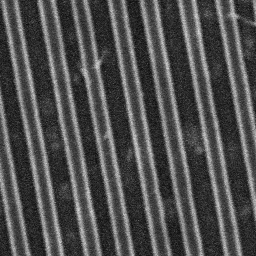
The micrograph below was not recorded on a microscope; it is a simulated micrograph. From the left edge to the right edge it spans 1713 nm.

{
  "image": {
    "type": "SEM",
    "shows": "parallel lines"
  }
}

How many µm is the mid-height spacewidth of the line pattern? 0.153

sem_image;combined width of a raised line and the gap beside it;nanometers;234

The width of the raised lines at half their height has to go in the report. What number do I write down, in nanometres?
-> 88.8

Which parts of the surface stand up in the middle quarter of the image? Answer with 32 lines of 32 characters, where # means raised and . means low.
.....####.....####....####......
#....####......###.....###......
#....####......###.....###......
#....####......###.....###......
#.....###......###.....###......
#.....###......####....####.....
#.....####.....####....####.....
#.....####......###.....###.....
##....####......###.....###.....
##.....###......###.....###.....
##.....###......###.....####....
##.....###......####....####....
###....####.....####.....###....
###....####......###.....###....
###.....###......###.....###....
###.....###......###.....###....
###.....###......####....####...
###.....####.....####....####...
####....####......###.....###...
####.....###......###.....###...
.###.....###......###.....###...
.###.....###......###.....####..
.###.....###......####....####..
.####....####.....####....####..
..###.....###......###.....###..
..###.....###......###.....####.
..###.....###......###.....####.
..###.....###......####....####.
..###.....####......###....####.
..####....####......###.....###.
...###.....###......###.....###.
...###.....###......###.....###.